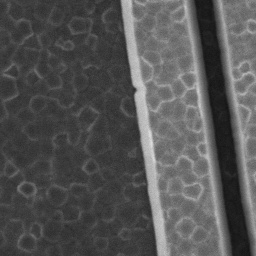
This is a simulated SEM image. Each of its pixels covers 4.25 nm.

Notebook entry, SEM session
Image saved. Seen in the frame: one or a few lines or trenches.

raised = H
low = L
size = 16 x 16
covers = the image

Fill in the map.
LLLLLLLLHHHHLLHH
LLLLLLLLHHHHLLHH
LLLLLLLLHHHHLLHH
LLLLLLLLHHHHLLHH
LLLLLLLLHHHHHLHH
LLLLLLLLLHHHHLHH
LLLLLLLLLHHHHLHH
LLLLLLLLLHHHHLLH
LLLLLLLLLHHHHLLH
LLLLLLLLLHHHHLLH
LLLLLLLLLHHHHLLH
LLLLLLLLLHHHHHLH
LLLLLLLLLLHHHHLH
LLLLLLLLLLHHHHLL
LLLLLLLLLLHHHHLL
LLLLLLLLLLHHHHLL